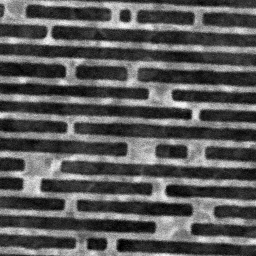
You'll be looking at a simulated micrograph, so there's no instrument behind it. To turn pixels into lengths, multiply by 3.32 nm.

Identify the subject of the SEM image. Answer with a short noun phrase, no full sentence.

parallel lines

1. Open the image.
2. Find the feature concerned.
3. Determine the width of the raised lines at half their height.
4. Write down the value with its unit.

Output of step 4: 17.4 nm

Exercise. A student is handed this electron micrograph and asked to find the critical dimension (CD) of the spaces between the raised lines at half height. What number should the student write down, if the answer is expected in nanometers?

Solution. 46.9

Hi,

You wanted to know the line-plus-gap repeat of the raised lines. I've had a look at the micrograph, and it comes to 19.2 px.